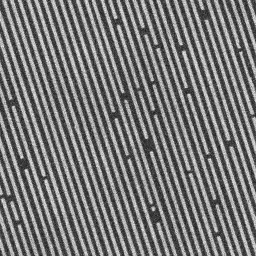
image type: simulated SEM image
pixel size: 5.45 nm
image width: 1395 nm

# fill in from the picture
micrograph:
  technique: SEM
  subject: parallel lines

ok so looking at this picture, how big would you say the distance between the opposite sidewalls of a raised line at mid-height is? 14.9 nm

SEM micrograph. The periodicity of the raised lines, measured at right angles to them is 42.3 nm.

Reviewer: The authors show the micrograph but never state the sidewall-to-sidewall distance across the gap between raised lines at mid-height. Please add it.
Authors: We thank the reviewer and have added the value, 28.5 nm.